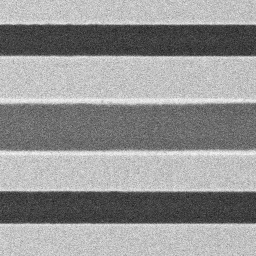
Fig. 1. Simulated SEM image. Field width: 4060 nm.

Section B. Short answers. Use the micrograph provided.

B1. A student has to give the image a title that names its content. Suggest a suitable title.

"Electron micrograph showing lines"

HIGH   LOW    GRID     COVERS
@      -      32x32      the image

@@@@@@@@@@@@@@@@@@@@@@@@@@@@@@@@
@@@@@@@@@@@@@@@@@@@@@@@@@@@@@@@@
@@@@@@@@@@@@@@@@@@@@@@@@@@@@@@@@
--------------------------------
--------------------------------
--------------------------------
--------------------------------
@@@@@@@@@@@@@@@@@@@@@@@@@@@@@@@@
@@@@@@@@@@@@@@@@@@@@@@@@@@@@@@@@
@@@@@@@@@@@@@@@@@@@@@@@@@@@@@@@@
@@@@@@@@@@@@@@@@@@@@@@@@@@@@@@@@
@@@@@@@@@@@@@@@@@@@@@@@@@@@@@@@@
------@----@@@@@@@@@@@@@@@@@@@@@
--------------------------------
--------------------------------
--------------------------------
--------------------------------
--------------------------------
--------------------------------
@@@@@@@@@@@@@@@@@@@@@@@@@@@@@@@@
@@@@@@@@@@@@@@@@@@@@@@@@@@@@@@@@
@@@@@@@@@@@@@@@@@@@@@@@@@@@@@@@@
@@@@@@@@@@@@@@@@@@@@@@@@@@@@@@@@
@@@@@@@@@@@@@@@@@@@@@@@@@@@@@@@@
--------------------------------
--------------------------------
--------------------------------
--------------------------------
@@@@@@@@@@@@@@@@@@@@@@@@@@@@@@@@
@@@@@@@@@@@@@@@@@@@@@@@@@@@@@@@@
@@@@@@@@@@@@@@@@@@@@@@@@@@@@@@@@
@@@@@@@@@@@@@@@@@@@@@@@@@@@@@@@@